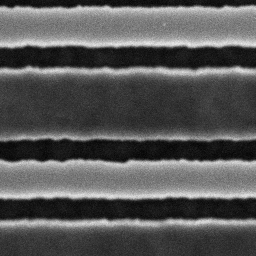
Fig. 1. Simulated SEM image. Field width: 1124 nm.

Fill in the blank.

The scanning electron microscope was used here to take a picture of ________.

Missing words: lines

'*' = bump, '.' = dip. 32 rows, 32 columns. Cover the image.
................................
********************************
********************************
********************************
********************************
********************************
................................
................................
...*...**....*..**.**........*..
********************************
********************************
********************************
********************************
********************************
********************************
********************************
********************************
*........**......*.......**..*..
................................
................................
********************************
********************************
********************************
********************************
********************************
................................
................................
.....*.........*.....**..***...*
********************************
********************************
********************************
********************************